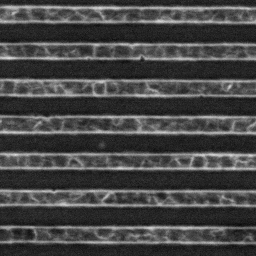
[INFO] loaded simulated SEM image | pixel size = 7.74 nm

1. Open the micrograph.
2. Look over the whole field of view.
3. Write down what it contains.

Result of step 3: parallel lines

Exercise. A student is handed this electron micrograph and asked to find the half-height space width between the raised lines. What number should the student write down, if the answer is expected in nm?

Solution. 165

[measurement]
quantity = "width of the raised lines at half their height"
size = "15.5 pixels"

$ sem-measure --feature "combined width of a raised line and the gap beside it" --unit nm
284